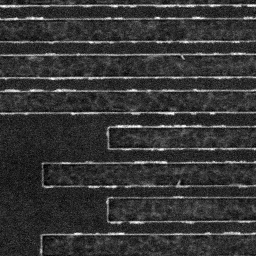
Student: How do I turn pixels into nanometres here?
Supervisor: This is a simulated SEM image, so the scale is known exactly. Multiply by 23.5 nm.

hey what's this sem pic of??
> parallel lines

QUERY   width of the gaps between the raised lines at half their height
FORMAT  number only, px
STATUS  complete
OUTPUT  22.6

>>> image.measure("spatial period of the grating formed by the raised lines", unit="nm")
844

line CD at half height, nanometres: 317